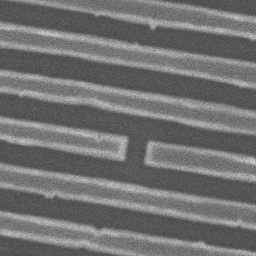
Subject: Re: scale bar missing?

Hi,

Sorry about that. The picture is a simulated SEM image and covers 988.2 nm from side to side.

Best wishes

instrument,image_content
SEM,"parallel lines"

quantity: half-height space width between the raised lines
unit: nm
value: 96.1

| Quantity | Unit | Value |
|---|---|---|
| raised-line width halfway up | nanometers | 83.4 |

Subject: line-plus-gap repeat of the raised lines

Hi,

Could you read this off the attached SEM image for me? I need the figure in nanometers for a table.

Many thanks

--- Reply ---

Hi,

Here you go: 180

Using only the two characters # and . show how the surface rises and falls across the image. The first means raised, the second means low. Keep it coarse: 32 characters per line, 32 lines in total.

......################..........
...........#################....
................################
####...................#########
##########.....................#
################................
......###############...........
............################....
...................#############
#####...................########
###########..................###
.###############................
......#################.........
.............###############....
...................#############
#####..................#########
###########...................##
.##############.................
.......########....####.........
..............#...############..
...................#############
#####...................########
############...................#
..################..............
........###############.........
.............#################..
....................############
######...................#######
###########....................#
.#################..............
........##################......
..............#################.